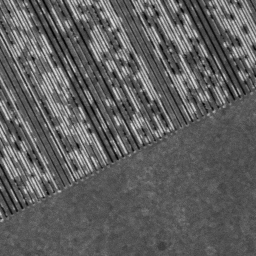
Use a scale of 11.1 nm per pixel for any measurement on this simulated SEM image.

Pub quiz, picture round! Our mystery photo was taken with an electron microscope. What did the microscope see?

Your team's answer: parallel lines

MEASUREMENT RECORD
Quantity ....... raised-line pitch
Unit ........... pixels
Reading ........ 5.94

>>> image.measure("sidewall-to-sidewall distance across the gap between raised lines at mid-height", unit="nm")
22.2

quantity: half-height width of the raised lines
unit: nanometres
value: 43.3